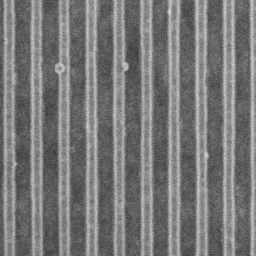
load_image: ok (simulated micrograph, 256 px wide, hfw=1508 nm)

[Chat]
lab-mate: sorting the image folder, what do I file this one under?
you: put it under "parallel lines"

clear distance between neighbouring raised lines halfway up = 110 nm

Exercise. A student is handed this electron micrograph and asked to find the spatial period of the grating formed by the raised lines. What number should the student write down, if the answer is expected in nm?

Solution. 162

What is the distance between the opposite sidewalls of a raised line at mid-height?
52.2 nanometres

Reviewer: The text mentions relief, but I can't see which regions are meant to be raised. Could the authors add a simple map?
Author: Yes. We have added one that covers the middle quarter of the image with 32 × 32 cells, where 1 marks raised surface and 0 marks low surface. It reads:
10000011000001110000110000010000
10000011000001100000110000010000
10000011000001100000110000010000
10000011000001100000110000011000
10000011000001100000110000011000
10000011000001100000110000011000
10000011000001100000110000011000
10000011000001100000110000011000
10000011000001100000110000010000
10000011000001100000110000110000
10000011000001100000110000110000
10000011000001100000110000010000
10000011000001100000110000110000
10000011000001100000110000110000
10000011000001100000110000110000
10000011000001100000110000110000
10000011000001100000110000110000
10000011000001100000110000111000
10000011000001100000110000111000
10000011000001100000110000111000
10000011000001100000110000111000
10000011000001100000110000111000
10000011000001100000110000111000
10000011000001100000110000111000
10000011000001100000110000111000
10000011000001100000110000111000
10000011000001100000110000111000
10000011000001100000110000111000
10000011000001100000110000111000
10000011000001100000110000111000
10000011000001100000110000111000
10000011000001100000110000111000